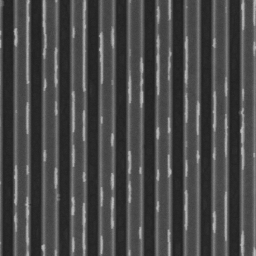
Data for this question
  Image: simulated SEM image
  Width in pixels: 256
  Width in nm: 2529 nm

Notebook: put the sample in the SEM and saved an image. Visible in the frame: parallel lines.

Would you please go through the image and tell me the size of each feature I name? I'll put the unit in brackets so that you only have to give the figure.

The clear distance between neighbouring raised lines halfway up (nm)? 122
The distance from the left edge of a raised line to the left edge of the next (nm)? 280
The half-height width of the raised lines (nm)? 157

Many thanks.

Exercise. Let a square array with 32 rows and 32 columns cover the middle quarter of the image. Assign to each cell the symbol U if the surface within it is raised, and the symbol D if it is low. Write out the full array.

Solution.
DDUUUUDDDUUUUDDDUUUUDDDUUUUDDDUU
DDUUUUDDDUUUUDDDUUUUDDDUUUUDDDUU
DDUUUUDDDUUUUDDDUUUUDDDUUUUDDDUU
DDUUUUDDDUUUUDDDUUUUDDDUUUUDDDUU
DDUUUUDDDUUUUDDDUUUUDDDUUUUDDDUU
DDUUUUDDDUUUUDDDUUUUDDDUUUUDDDUU
DDUUUUDDDUUUUDDDUUUUDDDUUUUDDDUU
DDUUUUDDDUUUUDDDUUUUDDDUUUUDDDUU
DDUUUUDDDUUUUDDDUUUUDDDUUUUDDDUU
DDUUUUDDDUUUUDDDUUUUDDDUUUUDDDUU
DDUUUUDDDUUUUDDDUUUUDDDUUUUDDDUU
DDUUUUDDDUUUUDDDUUUUDDDUUUUDDDUU
DDUUUUDDDUUUUDDDUUUUDDDUUUUDDDUU
DDUUUUDDDUUUUDDDUUUUDDDUUUUDDDUU
DDUUUUDDDUUUUDDDUUUUDDDUUUUDDDUU
DDUUUUDDDUUUUDDDUUUUDDDUUUUDDDUU
DDUUUUDDDUUUUDDDUUUUDDDUUUUDDDUU
DDUUUUDDDUUUUDDDUUUUDDDUUUUDDDUU
DDUUUUDDDUUUUDDDUUUUDDDUUUUDDDUU
DDUUUUDDDUUUUDDDUUUUDDDUUUUDDDUU
DDUUUUDDDUUUUDDDUUUUDDDUUUUDDDUU
DDUUUUDDDUUUUDDDUUUUDDDUUUUDDDUU
DDUUUUDDDUUUUDDDUUUUDDDUUUUDDDUU
DDUUUUDDDUUUUDDDUUUUDDDUUUUDDDUU
DDUUUUDDDUUUUDDDUUUUDDDUUUUDDDUU
DDUUUUDDDUUUUDDDUUUUDDDUUUUDDDUU
DDUUUUDDDUUUUDDDUUUUDDDUUUUDDDUU
DDUUUUDDDUUUUDDDUUUUDDDUUUUDDDUU
DDUUUUDDDUUUUDDDUUUUDDDUUUUDDDUU
DDUUUUDDDUUUUDDDUUUUDDDUUUUDDDUU
DDUUUUDDDUUUUDDDUUUUDDDUUUUDDDUU
DDUUUUDDDUUUUDDDUUUUDDDUUUUDDDUU